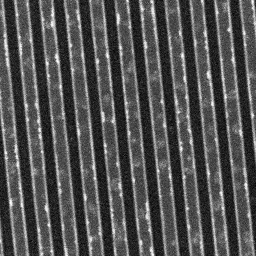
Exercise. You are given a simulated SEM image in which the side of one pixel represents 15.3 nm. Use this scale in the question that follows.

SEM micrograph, parallel lines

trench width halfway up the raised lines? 185 nm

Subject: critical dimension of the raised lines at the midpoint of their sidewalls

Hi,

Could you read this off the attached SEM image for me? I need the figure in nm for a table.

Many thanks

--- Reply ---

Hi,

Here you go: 199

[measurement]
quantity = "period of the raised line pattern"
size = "383 nm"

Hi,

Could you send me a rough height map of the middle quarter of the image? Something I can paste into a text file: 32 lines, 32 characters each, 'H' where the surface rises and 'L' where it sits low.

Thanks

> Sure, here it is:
LLHHHLLLHHHLLLHHHHLLLHHHLLLHHHLL
LLHHHLLLHHHLLLLHHHLLLHHHLLLHHHLL
LLHHHLLLHHHLLLLHHHLLLHHHLLLHHHLL
LLHHHLLLHHHHLLLHHHLLLHHHLLLHHHLL
LLHHHLLLLHHHLLLHHHLLLHHHLLLHHHLL
LLHHHLLLLHHHLLLHHHLLLHHHLLLLHHLL
LLHHHHLLLHHHLLLHHHLLLHHHLLLLHHHL
LLLHHHLLLHHHLLLHHHLLLHHHHLLLHHHL
LLLHHHLLLHHHLLLHHHLLLHHHHLLLHHHL
LLLHHHLLLHHHLLLHHHLLLHHHHLLLHHHL
LLLHHHLLLHHHLLLHHHHLLLHHHLLLHHHL
LLLHHHLLLHHHLLLLHHHLLLHHHLLLHHHL
LLLHHHLLLHHHLLLLHHHLLLHHHLLLHHHL
LLLHHHLLLHHHHLLLHHHLLLHHHLLLHHHL
LLLHHHLLLLHHHLLLHHHLLLHHHLLLHHHL
LLLHHHHLLLHHHLLLHHHLLLHHHLLLLHHL
LLLHHHHLLLHHHLLLHHHLLLHHHLLLLHHH
LLLLHHHLLLHHHLLLHHHLLLHHHHLLLHHH
LLLLHHHLLLHHHLLLHHHLLLLHHHLLLHHH
HLLLHHHLLLHHHLLLHHHLLLLHHHLLLHHH
HLLLHHHLLLHHHLLLHHHHLLLHHHLLLHHH
HLLLHHHLLLHHHLLLHHHHLLLHHHLLLHHH
HLLLHHHLLLHHHLLLHHHHLLLHHHLLLHHH
HLLLHHHLLLHHHHLLLHHHLLLHHHLLLHHH
HLLLHHHLLLLHHHLLLHHHLLLHHHLLLHHH
HLLLHHHHLLLHHHLLLHHHLLLHHHLLLLHH
HLLLHHHHLLLHHHLLLHHHLLLHHHLLLLHH
HHLLLHHHLLLHHHLLLHHHLLLHHHHLLLHH
HHLLLHHHLLLHHHLLLHHHLLLLHHHLLLHH
HHLLLHHHLLLHHHLLLHHHLLLLHHHLLLHH
HHLLLHHHLLLHHHLLLHHHHLLLHHHLLLHH
HHLLLHHHLLLHHHLLLLHHHLLLHHHLLLHH